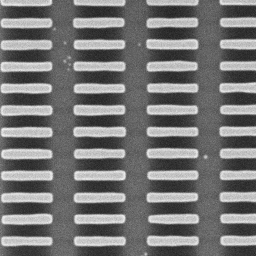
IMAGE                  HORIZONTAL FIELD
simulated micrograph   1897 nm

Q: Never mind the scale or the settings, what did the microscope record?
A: groups of lines, slits or small figures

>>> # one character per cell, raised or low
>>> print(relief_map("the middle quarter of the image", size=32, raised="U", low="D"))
DDDUUUUUUUUUUUUDDDDDDUUUUUUUUUUU
DDDDDDDDDDDDDUUDDDDDDUUUUDUUUUDD
DDDDDDDDDDDDDDDDDDDDDDDDDDDDDDDD
DDDDDDDDDDDDDDDDDDDDDDDDDDDDDDDD
DDDDDDDDDDDDDDDDDDDDDDDDDDDDDDDD
DDDUUUUUUUUUUUUDDDDDDUUUUUUUUUUU
DDDUUUUUUUUUUUUDDDDDDUUUUUUUUUUU
DDDDDDDDDDDDDDDDDDDDDDDDDDDDDDDD
DDDDDDDDDDDDDDDDDDDDDDDDDDDDDDDD
DDDDDDDDDDDDDDDDDDDDDDDDDDDDDDDD
DDDUUUDDDDDDDDDDDDDDDDDUUUUUDDDD
DDDUUUUUUUUUUUUDDDDDDUUUUUUUUUUU
DDDUUUUUUUUUUUUDDDDDDUUUUUUUUUUD
DDDDDDDDDDDDDDDDDDDDDDDDDDDDDDDD
DDDDDDDDDDDDDDDDDDDDDDDDDDDDDDDD
DDDDDDDDDDDDDDDDDDDDDDDDDDDDDDDD
DDDUUUUUUUUUUUUDDDDDDUUUUUUUUUUU
DDDUUUUUUUUUUUUDDDDDDUUUUUUUUUUU
DDDDDDDDDDDDDDDDDDDDDDDDDDDDDDDD
DDDDDDDDDDDDDDDDDDDDDDDDDDDDDDDD
DDDDDDDDDDDDDDDDDDDDDDDDDDDDDDDD
DDDUUUUUUUUUDUUDDDDDDUUUUUUUUUUU
DDDUUUUUUUUUUUUDDDDDDUUUUUUUUUUU
DDDUDDDDDDDDDDDDDDDDDDDDDDDDDDDD
DDDDDDDDDDDDDDDDDDDDDDDDDDDDDDDD
DDDDDDDDDDDDDDDDDDDDDDDDDDDDDDDD
DDDDDDDDDDDDDDDDDDDDDDDDDDDDDDDD
DDDUUUUUUUUUUUUDDDDDDUUUUUUUUUUU
DDDUUUUUUUUUUUUDDDDDDUUUUUUUUUUU
DDDDDDDDDDDDDDDDDDDDDDDDDDDDDDDD
DDDDDDDDDDDDDDDDDDDDDDDDDDDDDDDD
DDDDDDDDDDDDDDDDDDDDDDDDDDDDDDDD